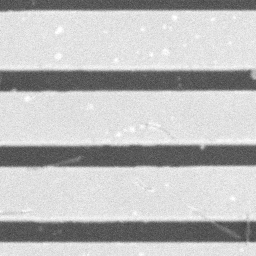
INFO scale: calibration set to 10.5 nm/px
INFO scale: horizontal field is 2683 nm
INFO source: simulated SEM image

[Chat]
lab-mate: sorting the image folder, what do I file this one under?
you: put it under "lines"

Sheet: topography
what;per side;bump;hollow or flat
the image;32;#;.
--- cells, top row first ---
................................
...#############################
################################
################################
################################
################################
################################
################################
################################
................................
................................
.....##.....#.########.#########
################################
################################
################################
################################
################################
################################
................................
................................
................................
################################
################################
################################
################################
################################
################################
#..##################.#.#.####.#
................................
................................
################################
################################